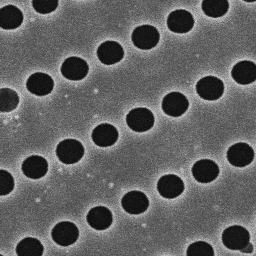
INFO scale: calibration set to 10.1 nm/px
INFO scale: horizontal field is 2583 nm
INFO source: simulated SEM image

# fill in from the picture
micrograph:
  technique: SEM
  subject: a regular array of holes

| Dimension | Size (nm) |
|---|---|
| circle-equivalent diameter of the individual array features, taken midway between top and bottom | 264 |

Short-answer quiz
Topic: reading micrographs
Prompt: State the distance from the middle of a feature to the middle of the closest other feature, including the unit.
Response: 0.385 micrometres